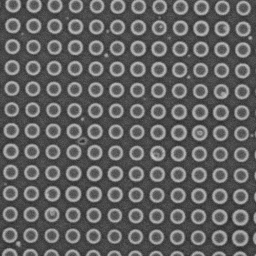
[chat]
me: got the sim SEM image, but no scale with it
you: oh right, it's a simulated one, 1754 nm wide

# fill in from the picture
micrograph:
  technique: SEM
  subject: an array of small figures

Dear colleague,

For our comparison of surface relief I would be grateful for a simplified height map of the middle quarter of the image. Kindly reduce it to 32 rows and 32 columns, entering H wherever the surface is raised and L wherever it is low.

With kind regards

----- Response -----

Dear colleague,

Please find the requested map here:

LHHHLLHHHHLLHHHLLHHHLLHHHLLHHHLL
LHHHLLHHHHLLHHHLLHHHLLHHHLLHHHHL
LLHHLLLHHLLLHHHLLHHHLLHHHLLHHHLL
LLLLLLLLLLLLLLLLLLLLLLLLLLLLLLLL
LLLLLLLLLLLLLLLLLLLLLLLLLLLLLLLL
LHHHLLHHHLLLHHHLLHHHLLHHHLLLHHLL
LHHHLLHHHHLHHHHLLHHHLLHHHLLHHHHL
LHHHLLLHHLLLHHHLLHHHLLHHHLLHHHLL
LLLLLLLLLLLLLLLLLLLLLLLLLLLLLLLL
LLLLLLLLLLLLLLLLLLLLLLLLLLLLLLLL
LHHHLLLHHLLLHHLLLHHLLLHHHLLLHHLL
LHHHLLHHHHLHHHHLLHHHLLHHHLLHHHHL
LHHHLLHHHLLHHHHLLHHHLLHHHLLHHHHL
LLLLLLLLLLLLLLLLLLLLLLLHHLLLHHLL
LLLLLLLLLLLLLLLLLLLLLLLLLLLLLLLL
LHHHLLLHHLLLHHLLLHHLLLLHLLLLHHLL
LHHHLLHHHLLHHHHLLHHHLLHHHLLHHHLL
LHHHLLHHHLLHHHHLLHHHLLHHHLLHHHHL
LLHLLLLHHLLLHHLLLHHLLLHHHLLHHHLL
LLLLLLLLLLLLLLLLLLLLLLLLLLLLLLLL
LLHLLLLHHLLLLLLLLLLLLLLLLLLLLLLL
LHHHLLHHHLLHHHHLLHHHLLHHHLLHHHLL
LHHHLLHHHLLHHHHLLHHHLLHHHLLHHHLL
LHHLLLHHHLLLHHLLLHHLLLHHHLLHHHLL
LLLLLLLLLLLLLLLLLLLLLLLLLLLLLLLL
LLLLLLLLLLLLLLLLLLLLLLLLLLLLLLLL
LHHHLLHHHLLHHHLLLHHHLLHHHLLHHHLL
LHHHLLHHHLLHHHHLHHHHLLHHHLLHHHLL
LHHHLLHHHLLHHHLLLHHHLLHHHLLHHHLL
LLLLLLLLLLLLLLLLLLLLLLLLLLLLLLLL
LLLLLLLLLLLLLLLLLLLLLLLLLLLLLLLL
LHHHLLHHHLLHHHLLLHHLLLHHLLLHHHLL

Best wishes